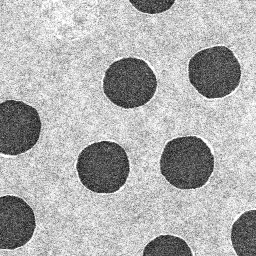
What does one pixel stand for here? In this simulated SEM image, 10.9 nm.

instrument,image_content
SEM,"holes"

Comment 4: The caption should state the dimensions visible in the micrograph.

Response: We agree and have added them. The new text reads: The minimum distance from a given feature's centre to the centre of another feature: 924 nm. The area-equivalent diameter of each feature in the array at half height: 53.9 px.